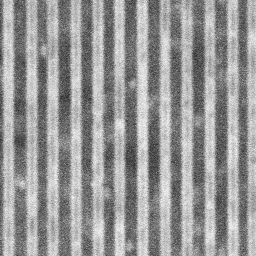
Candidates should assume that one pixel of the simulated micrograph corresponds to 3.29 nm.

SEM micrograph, parallel lines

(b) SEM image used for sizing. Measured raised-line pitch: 73.7 nanometers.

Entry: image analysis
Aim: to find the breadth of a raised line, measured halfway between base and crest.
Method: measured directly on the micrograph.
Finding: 24.6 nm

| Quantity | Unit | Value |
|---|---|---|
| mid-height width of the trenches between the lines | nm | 49.5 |